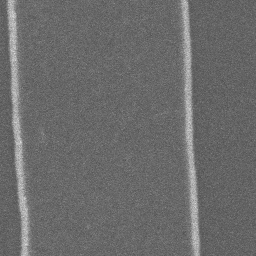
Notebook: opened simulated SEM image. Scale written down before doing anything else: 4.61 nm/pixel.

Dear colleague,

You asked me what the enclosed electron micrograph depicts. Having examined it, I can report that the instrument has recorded one or a few lines or trenches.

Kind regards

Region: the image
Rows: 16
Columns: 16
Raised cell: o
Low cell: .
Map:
.ooooooooooo....
.ooooooooooo....
.ooooooooooo....
.ooooooooooo....
.ooooooooooo....
.ooooooooooo....
.ooooooooooo....
.ooooooooooo....
.ooooooooooo....
.ooooooooooo....
.ooooooooooo....
.ooooooooooo....
.ooooooooooo....
.ooooooooooo....
..oooooooooo....
.ooooooooooo....